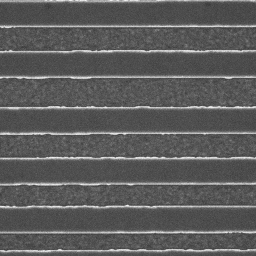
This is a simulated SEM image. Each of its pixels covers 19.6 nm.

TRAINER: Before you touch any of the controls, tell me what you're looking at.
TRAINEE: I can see lines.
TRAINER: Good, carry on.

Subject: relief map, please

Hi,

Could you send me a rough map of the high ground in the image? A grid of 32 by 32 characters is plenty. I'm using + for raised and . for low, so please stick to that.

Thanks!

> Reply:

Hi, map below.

++++++++++++++++++++++++++++++++
++++++++++++++++++++++++++++++++
++++++++++++++++++++++++++++++++
................................
................................
................................
++++++++++++++++++++++++++++++++
++++++++++++++++++++++++++++++++
++++++++++++++++++++++++++++++++
++++++++++++++++++++++++++++++++
................................
................................
................................
++++++++++++++++++++++++++++++++
++++++++++++++++++++++++++++++++
++++++++++++++++++++++++++++++++
++++++++++++++++++++++++++++++++
................................
................................
................................
++++++++++++++++++++++++++++++++
++++++++++++++++++++++++++++++++
++++++++++++++++++++++++++++++++
................................
................................
................................
++++++++++++++++++++++++++++++++
++++++++++++++++++++++++++++++++
++++++++++++++++++++++++++++++++
................................
................................
++++++++++++++++++++++++++++++++